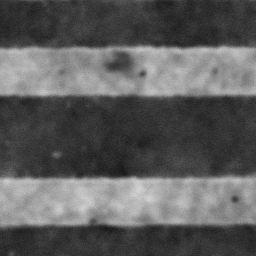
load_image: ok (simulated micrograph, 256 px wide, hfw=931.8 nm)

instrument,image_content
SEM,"lines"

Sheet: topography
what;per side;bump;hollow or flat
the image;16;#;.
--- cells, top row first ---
................
................
................
################
################
################
................
................
................
................
................
################
################
################
................
................